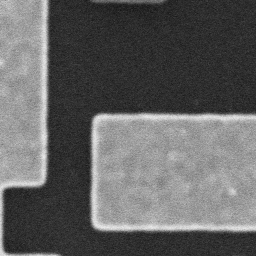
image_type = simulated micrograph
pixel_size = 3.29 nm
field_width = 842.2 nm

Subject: wiring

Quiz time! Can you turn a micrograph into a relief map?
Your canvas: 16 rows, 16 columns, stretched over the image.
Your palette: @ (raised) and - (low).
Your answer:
@@@-------------
@@@-------------
@@@-------------
@@@-------------
@@@-------------
@@@-------------
@@@-------------
@@@---@@@@@@@@@@
@@@---@@@@@@@@@@
@@@---@@@@@@@@@@
@@@---@@@@@@@@@@
@@----@@@@@@@@@@
------@@@@@@@@@@
------@@@@@@@@@@
----------------
----------------